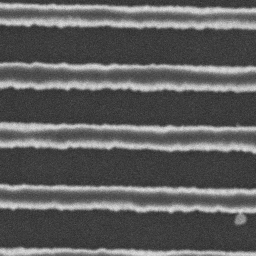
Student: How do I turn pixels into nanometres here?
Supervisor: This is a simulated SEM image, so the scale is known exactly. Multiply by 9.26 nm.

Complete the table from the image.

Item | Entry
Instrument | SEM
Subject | lines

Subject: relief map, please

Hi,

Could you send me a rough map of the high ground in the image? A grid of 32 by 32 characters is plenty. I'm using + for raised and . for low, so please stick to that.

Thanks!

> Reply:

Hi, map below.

................................
++++++++++++++++++++++++++++++++
++++++++++++++++++++++++++++++++
........................+..++..+
................................
................................
................................
................................
+++++++++++++++++++++++++++...++
++++++++++++++++++++++++++++++++
++++++++++++++++++++++++++++++++
................................
................................
................................
................................
................................
++++++++++++++++++++++++++++++++
++++++++++++++++++++++++++++++++
.................+.+++++++++++++
................................
................................
................................
................................
+++++++++++++++++...............
++++++++++++++++++++++++++++++++
++++++++++++++++++++++++++++++++
.............................+.+
................................
................................
................................
................................
++++++++++++++++++...++++++.....